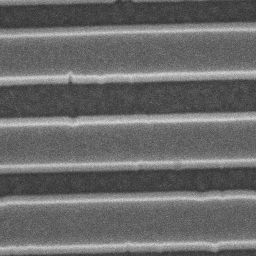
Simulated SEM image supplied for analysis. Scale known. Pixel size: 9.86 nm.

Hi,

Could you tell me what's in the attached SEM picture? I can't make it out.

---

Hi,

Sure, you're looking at one or a few lines or trenches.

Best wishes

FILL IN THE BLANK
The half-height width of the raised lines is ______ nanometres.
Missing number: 470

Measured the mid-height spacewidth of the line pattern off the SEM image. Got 323 nanometers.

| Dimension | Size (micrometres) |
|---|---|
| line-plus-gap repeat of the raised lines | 0.832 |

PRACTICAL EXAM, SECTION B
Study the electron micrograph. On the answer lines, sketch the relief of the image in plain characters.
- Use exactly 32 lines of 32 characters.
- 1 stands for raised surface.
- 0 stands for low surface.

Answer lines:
00000000000000000000000000000000
00000000000000000000000000000000
00000000000000000000000000000000
00000000000000000000000111011111
11111111111111111111111111111111
11111111111111111111111111111111
11111111111111111111111111111111
11111111111111111111111111111111
11111111111111111111111111111111
11111111111111111111110000000000
00000000000000000000000000000000
00000000000000000000000000000000
00000000000000000000000000000000
00000000000000000000000000000000
00000000000000000000000000000000
11111111111111111111111111111111
11111111111111111111111111111111
11111111111111111111111111111111
11111111111111111111111111111111
11111111111111111111111111111111
11111111111111111111111000000000
00000000000000000000000000000000
00000000000000000000000000000000
00000000000000000000000000000000
00000000000000000000000000111111
11111111111111111111111111111111
11111111111111111111111111111111
11111111111111111111111111111111
11111111111111111111111111111111
11111111111111111111111111111111
11111111111111111111111111111111
00000000000000000000000000000000